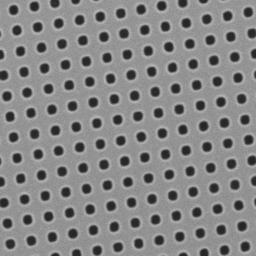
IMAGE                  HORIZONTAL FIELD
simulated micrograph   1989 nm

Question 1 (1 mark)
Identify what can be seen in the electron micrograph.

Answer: a regular array of holes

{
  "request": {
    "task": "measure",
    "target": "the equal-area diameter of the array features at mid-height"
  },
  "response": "78.4 nm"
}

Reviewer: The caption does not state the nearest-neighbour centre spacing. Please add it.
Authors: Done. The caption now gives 0.161 µm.